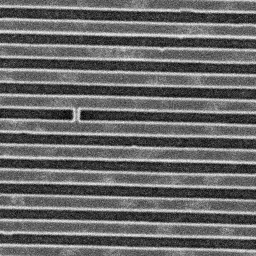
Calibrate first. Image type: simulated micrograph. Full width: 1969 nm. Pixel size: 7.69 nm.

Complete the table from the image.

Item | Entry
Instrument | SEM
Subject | parallel lines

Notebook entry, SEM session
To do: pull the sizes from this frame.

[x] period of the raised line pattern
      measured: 193 nm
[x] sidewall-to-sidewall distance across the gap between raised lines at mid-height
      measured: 92.3 nanometers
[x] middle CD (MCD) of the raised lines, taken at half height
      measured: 105 nm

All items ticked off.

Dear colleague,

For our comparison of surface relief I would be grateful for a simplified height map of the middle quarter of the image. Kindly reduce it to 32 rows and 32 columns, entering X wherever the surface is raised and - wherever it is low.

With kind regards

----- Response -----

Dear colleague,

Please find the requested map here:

--------------------------------
--------------------------------
XXXXXXXXXXXXXXXXXXXXXXXXXXXXX---
XXXXXXXXXXXXXXXXXXXXXXXXXXXXXXXX
XXXXXXXXXXXXXXXXXXXXXXXXXXXXXXXX
-----------------------------XXX
--------------------------------
--------------------------------
XXXXXXXXXXXXXXXXXXXX------------
XXXXXXXXXXXXXXXXXXXXXXXXXXXXXXXX
XXXXXXXXXXXXXXXXXXXXXXXXXXXXXXXX
--XX-----------------XXXXXXXXXXX
--XX----------------------------
--XX----------------------------
XXXXXXXXXXX---------------------
XXXXXXXXXXXXXXXXXXXXXXXXXXXXXXXX
XXXXXXXXXXXXXXXXXXXXXXXXXXXXXXXX
---XXXXXXXXXXXXXXXXXXXXXXXXXXXXX
--------------------------------
--------------------------------
XX------------------------------
XXXXXXXXXXXXXXXXXXXXXXXXXXXXXXXX
XXXXXXXXXXXXXXXXXXXXXXXXXXXXXXXX
XXXXXXXXXXXXXXXXXXXXXXXXXXXXXXXX
--------------------------------
--------------------------------
--------------------------------
XXXXXXXXXXXXXXXXXXXXXXXXXX------
XXXXXXXXXXXXXXXXXXXXXXXXXXXXXXXX
XXXXXXXXXXXXXXXXXXXXXXXXXXXXXXXX
---------------------------XXXXX
--------------------------------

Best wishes